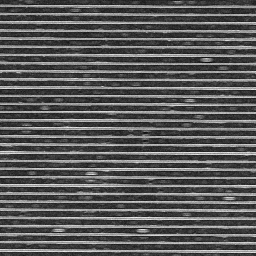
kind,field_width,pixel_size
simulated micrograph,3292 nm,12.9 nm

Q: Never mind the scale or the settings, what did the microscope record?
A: parallel lines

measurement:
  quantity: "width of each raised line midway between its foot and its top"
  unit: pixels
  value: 2.12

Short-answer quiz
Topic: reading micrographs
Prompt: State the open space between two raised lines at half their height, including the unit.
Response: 75.5 nm